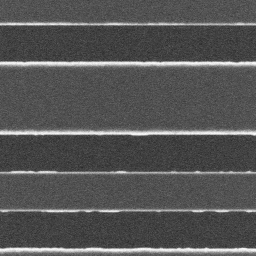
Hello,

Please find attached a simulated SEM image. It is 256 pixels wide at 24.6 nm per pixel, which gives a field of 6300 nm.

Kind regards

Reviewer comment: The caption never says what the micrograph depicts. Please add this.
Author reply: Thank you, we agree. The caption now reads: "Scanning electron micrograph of lines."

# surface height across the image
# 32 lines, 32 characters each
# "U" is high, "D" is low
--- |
UUUUUUUUUUUUUUUUUUUUUUUUUUUUUUUU
UUUUUUUUUUUUUUUUUUUUUUUUUUUUUUUU
UUUUUUUUUUUUUUUUUUUUUUUUUUUUUUUU
DDDDDDDDDDDDDDDDDDDDDDDDDDDDDDDD
DDDDDDDDDDDDDDDDDDDDDDDDDDDDDDDD
DDDDDDDDDDDDDDDDDDDDDDDDDDDDDDDD
DDDDDDDDDDDDDDDDDDDDDDDDDDDDDDDD
DDDDDDDDDDDDDDDDDDDDDDDDDDDDDDDD
UUUUUUUUUUUUUUUUUUUUUUUUUUUUUUUU
UUUUUUUUUUUUUUUUUUUUUUUUUUUUUUUU
UUUUUUUUUUUUUUUUUUUUUUUUUUUUUUUU
UUUUUUUUUUUUUUUUUUUUUUUUUUUUUUUU
UUUUUUUUUUUUUUUUUUUUUUUUUUUUUUUU
UUUUUUUUUUUUUUUUUUUUUUUUUUUUUUUU
UUUUUUUUUUUUUUUUUUUUUUUUUUUUUUUU
UUUUUUUUUUUUUUUUUUUUUUUUUUUUUUUU
UUUUUUUUUUUUUUUUUUUUUUUUUUUUUUUU
DDDDDDDDDDDDDDDDDDDDDDDDDDDDDDDD
DDDDDDDDDDDDDDDDDDDDDDDDDDDDDDDD
DDDDDDDDDDDDDDDDDDDDDDDDDDDDDDDD
DDDDDDDDDDDDDDDDDDDDDDDDDDDDDDDD
DUUUUUUDDDDDDDUUDDDDDDDDUDDUUDDU
UUUUUUUUUUUUUUUUUUUUUUUUUUUUUUUU
UUUUUUUUUUUUUUUUUUUUUUUUUUUUUUUU
UUUUUUUUUUUUUUUUUUUUUUUUUUUUUUUU
UUUUUUUUUUUUUUUUUUUUUUUUUUUUUUUU
DDDDDDDDDDDDDDDDDDDDDDDDDDDDDDDD
DDDDDDDDDDDDDDDDDDDDDDDDDDDDDDDD
DDDDDDDDDDDDDDDDDDDDDDDDDDDDDDDD
DDDDDDDDDDDDDDDDDDDDDDDDDDDDDDDD
DDDDDDDDDDDDDDDDDDDDDDDDDDDDDDDD
UUUUUUUUUUUUUUUUUUUUUUUUUUUUUUUU